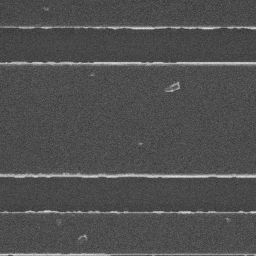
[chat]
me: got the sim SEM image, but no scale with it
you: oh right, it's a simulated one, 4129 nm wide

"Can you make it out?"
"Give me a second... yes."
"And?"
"lines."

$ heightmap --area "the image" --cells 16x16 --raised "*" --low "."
****************
****************
................
................
****************
****************
****************
****************
****************
****************
****************
................
................
****************
****************
****************